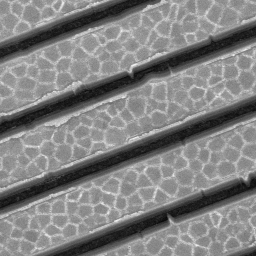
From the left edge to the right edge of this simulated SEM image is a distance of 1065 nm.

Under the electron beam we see one or a few lines or trenches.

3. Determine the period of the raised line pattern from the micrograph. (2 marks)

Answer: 0.293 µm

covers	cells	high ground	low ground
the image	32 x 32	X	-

XXXXXXXXXXXXX------XXXXXXXXXXXXX
XXXXXXXXXX-------XXXXXXXXXXXXXXX
XXXXXXXX------XXXXXXXXXXXXXXXXXX
XXXXX------XXXXXXXXXXXXXXXXXXX--
XXX------XXXXXXXXXXXXXXXXXX-----
------XXXXXXXXXXXXXXXXXXX------X
----XXXXXXXXXXXXXXXXXX-------XXX
-XXXXXXXXXXXXXXXXXX-------XXXXXX
XXXXXXXXXXXXXXXXX------XXXXXXXXX
XXXXXXXXXXXXXX-------XXXXXXXXXXX
XXXXXXXXXXXX------XXXXXXXXXXXXXX
XXXXXXXXX------XXXXXXXXXXXXXXXXX
XXXXXX-------XXXXXXXXXXXXXXXXXX-
XXX-------XXXXXXXXXXXXXXXXXX----
X------XXXXXXXXXXXXXXXXXX-------
-----XXXXXXXXXXXXXXXXXX------XXX
--XXXXXXXXXXXXXXXXXX-------XXXXX
XXXXXXXXXXXXXXXXXX------XXXXXXXX
XXXXXXXXXXXXXXX-------XXXXXXXXXX
XXXXXXXXXXXX-------XXXXXXXXXXXXX
XXXXXXXXXX------XXXXXXXXXXXXXXXX
XXXXXXX-------XXXXXXXXXXXXXXXXXX
XXXXX------XXXXXXXXXXXXXXXXXXX--
XX------XXXXXXXXXXXXXXXXXXX-----
------XXXXXXXXXXXXXXXXXX-------X
---XXXXXXXXXXXXXXXXXX-------XXXX
-XXXXXXXXXXXXXXXXXX-------XXXXXX
XXXXXXXXXXXXXXXX-------XXXXXXXXX
XXXXXXXXXXXXXX------XXXXXXXXXXXX
XXXXXXXXXXX-------XXXXXXXXXXXXXX
XXXXXXXX-------XXXXXXXXXXXXXXXXX
XXXXXX-------XXXXXXXXXXXXXXXXX--